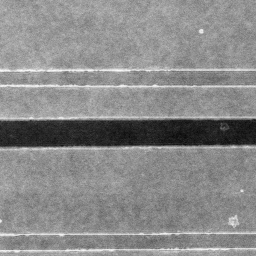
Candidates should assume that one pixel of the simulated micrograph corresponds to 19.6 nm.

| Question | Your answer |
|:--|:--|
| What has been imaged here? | lines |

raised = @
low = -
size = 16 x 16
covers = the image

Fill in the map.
@@@@@@@@@@@@@@@@
@@@@@@@@@@@@@@@@
@@@@@@@@@@@@@@@@
@@@@@@@@@@@@@@@@
@@@@@@@@@@@@@@@@
@@@@@@@@@@@@@@@@
@@@@@@@@@@@@@@@@
----------------
----------------
@@@@@@@@@@@@@@@@
@@@@@@@@@@@@@@@@
@@@@@@@@@@@@@@@@
@@@@@@@@@@@@@@@@
@@@@@@@@@@@@@@@@
@@@@@@@@@@@@@@@@
@@@@@@@@@@@@@@@@